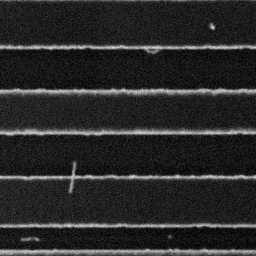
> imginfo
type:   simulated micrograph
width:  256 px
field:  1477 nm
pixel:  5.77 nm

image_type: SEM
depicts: lines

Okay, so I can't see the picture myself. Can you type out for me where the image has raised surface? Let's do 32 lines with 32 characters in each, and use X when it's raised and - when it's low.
XXXXXXXXXXXXXXXXXXXXXXXXXXXXXXXX
XXXXXXXXXXXXXXXXXXXXXXXXXXXXXXXX
XXXXXXXXXXXXXXXXXXXXXXXXXXXXXXXX
XXXXXXXXXXXXXXXXXXXXXXXXXXXXXXXX
XXXXXXXXXXXXXXXXXXXXXXXXXXXXXXXX
XXXXXXXXXXXXXXXXXXXXXXXXXXXXXXXX
--------------------------------
--------------------------------
--------------------------------
--------------------------------
--------------------------------
XXXXXXXXXXXXXXXXXXXXXXXXXXXXXXXX
XXXXXXXXXXXXXXXXXXXXXXXXXXXXXXXX
XXXXXXXXXXXXXXXXXXXXXXXXXXXXXXXX
XXXXXXXXXXXXXXXXXXXXXXXXXXXXXXXX
XXXXXXXXXXXXXXXXXXXXXXXXXXXXXXXX
XXXXXXXXXXXXXXXXXXXXXXXXXXXXXXXX
--------------------------------
--------------------------------
--------------------------------
--------------------------------
--------------------------------
XXXXXXXXXXXXXXXXXXXXXXXXXXXXXXXX
XXXXXXXXXXXXXXXXXXXXXXXXXXXXXXXX
XXXXXXXXXXXXXXXXXXXXXXXXXXXXXXXX
XXXXXXXXXXXXXXXXXXXXXXXXXXXXXXXX
XXXXXXXXXXXXXXXXXXXXXXXXXXXXXXXX
XXXXXXXXXXXXXXXXXXXXXXXXXXXXXXXX
--------------------------------
--------------------------------
--------------------------------
XXXXXXXXXXXXXXXXXXXXXXXXXXXXXXXX